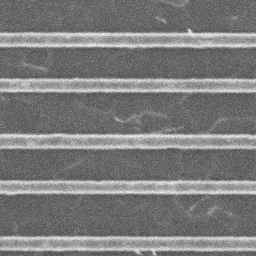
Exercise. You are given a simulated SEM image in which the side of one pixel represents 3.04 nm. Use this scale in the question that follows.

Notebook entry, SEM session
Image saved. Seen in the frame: parallel lines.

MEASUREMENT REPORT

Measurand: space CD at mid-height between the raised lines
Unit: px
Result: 38.2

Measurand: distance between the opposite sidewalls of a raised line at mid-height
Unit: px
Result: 12.2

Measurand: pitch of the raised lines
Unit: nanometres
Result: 155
